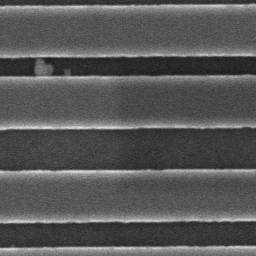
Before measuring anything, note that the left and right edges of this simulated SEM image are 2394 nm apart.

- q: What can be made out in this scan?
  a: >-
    lines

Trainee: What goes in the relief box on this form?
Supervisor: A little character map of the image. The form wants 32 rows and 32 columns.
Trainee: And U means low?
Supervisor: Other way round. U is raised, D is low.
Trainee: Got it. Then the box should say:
DDDDDDDDDDDDDDDDDDDDDDDDDDDDDDDD
UUUUUUUUUUUUUUUUUUUUUUUUUUUUUUUU
UUUUUUUUUUUUUUUUUUUUUUUUUUUUUUUU
UUUUUUUUUUUUUUUUUUUUUUUUUUUUUUUU
UUUUUUUUUUUUUUUUUUUUUUUUUUUUUUUU
UUUUUUUUUUUUUUUUUUUUUUUUUUUUUUUU
UUUUUUUUUUUUUUUUUUUUUUUUUUUUUUUU
DDDDDDDDDDDDDDDDDDDDDDDDDDDDDDDD
DDDDDDDDDDDDDDDDDDDDDDDDDDDDDDDD
DDDDDDDDDDDDDDDDDUDDUUUUUUUUUUUU
UUUUUUUUUUUUUUUUUUUUUUUUUUUUUUUU
UUUUUUUUUUUUUUUUUUUUUUUUUUUUUUUU
UUUUUUUUUUUUUUUUUUUUUUUUUUUUUUUU
UUUUUUUUUUUUUUUUUUUUUUUUUUUUUUUU
UUUUUUUUUUUUUUUUUUUUUUUUUUUUUUUU
UUUUUUUUUUUUUUUUUUUUUUUUUUUUUUUU
DDDDDDDDDDDDDDDDDDDDDDDDDDDDDDDD
DDDDDDDDDDDDDDDDDDDDDDDDDDDDDDDD
DDDDDDDDDDDDDDDDDDDDDDDDDDDDDDDD
DDDDDDDDDDDDDDDDDDDDDDDDDDDDDDDD
DDDDDDDDDDDDDDDDDDDDDDDDDDDDDDDD
UUUUUUUUUUUUUUUUUUUUUUUUUUUUUUUU
UUUUUUUUUUUUUUUUUUUUUUUUUUUUUUUU
UUUUUUUUUUUUUUUUUUUUUUUUUUUUUUUU
UUUUUUUUUUUUUUUUUUUUUUUUUUUUUUUU
UUUUUUUUUUUUUUUUUUUUUUUUUUUUUUUU
UUUUUUUUUUUUUUUUUUUUUUUUUUUUUUUU
UUUUUUUUUUUUUUUUUUUUUUUUUUUUUUUU
DDDDDDDDDDDDDDDDDDDDDDDDDDDDDDDD
DDDDDDDDDDDDDDDDDDDDDDDDDDDDDDDD
DDDDDDDDDDDDDDDDDDDDDDDDDDDDDDDD
UUUUUUUUUUUUUUUUUUUUUUUUUUUUUUUU